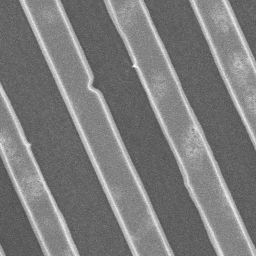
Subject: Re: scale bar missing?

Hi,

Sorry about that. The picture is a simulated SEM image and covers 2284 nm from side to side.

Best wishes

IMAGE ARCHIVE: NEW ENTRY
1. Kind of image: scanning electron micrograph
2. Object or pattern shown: one or a few lines or trenches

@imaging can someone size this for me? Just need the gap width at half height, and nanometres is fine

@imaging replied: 402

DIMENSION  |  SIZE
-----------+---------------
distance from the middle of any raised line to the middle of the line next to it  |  78.3 pixels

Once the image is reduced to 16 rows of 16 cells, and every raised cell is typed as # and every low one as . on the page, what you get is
..##...##...##..
..##...##....##.
..###...##...##.
...##...##...###
...###...##...##
....##...##...##
#...###..###...#
#....##...##...#
#....##...###...
##....##...##...
##....##...###..
.##...###...##..
.##....##...##..
..##...###...##.
..##....##...##.
...##...###...##